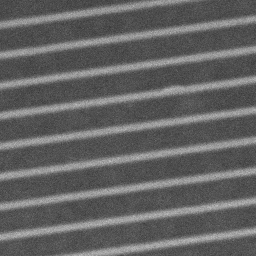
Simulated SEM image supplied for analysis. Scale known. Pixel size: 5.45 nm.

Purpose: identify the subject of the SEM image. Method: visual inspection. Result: parallel lines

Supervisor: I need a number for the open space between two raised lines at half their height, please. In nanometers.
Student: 122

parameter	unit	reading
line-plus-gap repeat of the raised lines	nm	163